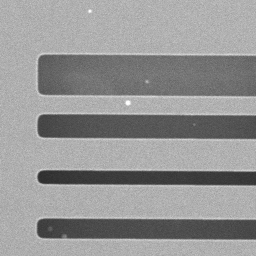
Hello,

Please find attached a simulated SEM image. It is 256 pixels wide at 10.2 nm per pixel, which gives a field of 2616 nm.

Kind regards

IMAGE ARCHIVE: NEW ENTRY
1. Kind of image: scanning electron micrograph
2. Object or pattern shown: groups of lines, slits or small figures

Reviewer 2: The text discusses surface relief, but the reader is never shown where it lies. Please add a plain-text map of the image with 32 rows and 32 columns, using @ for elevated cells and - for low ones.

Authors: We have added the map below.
@@@@@@@@@@@@@@@@@@@@@@@@@@@@@@@@
@@@@@@@@@@@@@@@@@@@@@@@@@@@@@@@@
@@@@@@@@@@@@@@@@@@@@@@@@@@@@@@@@
@@@@@@@@@@@@@@@@@@@@@@@@@@@@@@@@
@@@@@@@@@@@@@@@@@@@@@@@@@@@@@@@@
@@@@@@@@@@@@@@@@@@@@@@@@@@@@@@@@
@@@@@@@@@@@@@@@@@@@@@@@@@@@@@@@@
@@@@@---------------------------
@@@@@---------------------------
@@@@@---------------------------
@@@@@---------------------------
@@@@@---------------------------
@@@@@@@@@@@@@@@@@@@@@@@@@@@@@@@@
@@@@@@@@@@@@@@@@@@@@@@@@@@@@@@@@
@@@@@---------------------------
@@@@@---------------------------
@@@@@---------------------------
@@@@@@@@@@@@@@@@@@@@@@@@@@------
@@@@@@@@@@@@@@@@@@@@@@@@@@@@@@@@
@@@@@@@@@@@@@@@@@@@@@@@@@@@@@@@@
@@@@@@@@@@@@@@@@@@@@@@@@@@@@@@@@
@@@@@---------------------------
@@@@@---------------------------
@@@@@@@@@@@@@@@@@@@@@@@@@@@@@@@@
@@@@@@@@@@@@@@@@@@@@@@@@@@@@@@@@
@@@@@@@@@@@@@@@@@@@@@@@@@@@@@@@@
@@@@@@@@@@@@@@@@@@@@@@@@@@@@@@@@
@@@@@---------------------------
@@@@@---------------------------
@@@@@---------------------------
@@@@@@@@@@@@@@@@@@@@@@@@@@@@@@@@
@@@@@@@@@@@@@@@@@@@@@@@@@@@@@@@@